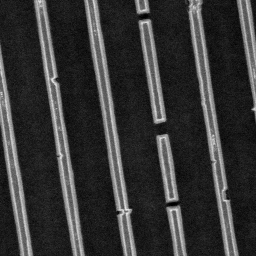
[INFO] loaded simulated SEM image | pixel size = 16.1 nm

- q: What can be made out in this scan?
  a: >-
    parallel lines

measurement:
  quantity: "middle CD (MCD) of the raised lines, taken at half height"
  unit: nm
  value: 141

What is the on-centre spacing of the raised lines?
814 nm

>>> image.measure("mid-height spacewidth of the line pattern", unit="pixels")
42.1